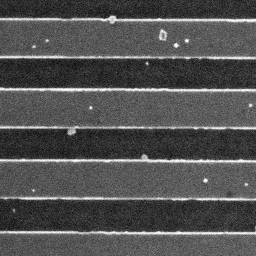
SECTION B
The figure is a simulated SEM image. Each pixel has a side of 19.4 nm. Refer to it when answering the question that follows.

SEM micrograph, lines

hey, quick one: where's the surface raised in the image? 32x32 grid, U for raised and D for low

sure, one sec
DDDDDDDDDDDDDDDDDDDDDDDDDDDDDDDD
DDDDDDDDDDDDDDDDDDDDDDDDDDDDDDDD
UUUUUUUUUUUUUUUUUUUUUUUUUUUUUDUU
UUUUUUUUUUUUUUUUUUUUUUUUUUUUUUUU
UUUUUUUUUUUUUUUUUUUUUUUUUUUUUUUU
UUUUUUUUUUUUUUUUUUUUUUUUUUUUUUUU
UUUUUUUUUUUUUUUUUUUUUUUUUUUUUUUU
DDDDDDDDDDDDDDDDDDDDDDDDDDDDDDDD
DDDDDDDDDDDDDDDDDDDDDDDDDDDDDDDD
DDDDDDDDDDDDDDDDDDDDDDDDDDDDDDDD
DDDDDDDDDDDDDDDDDDDDDDDDDDDDDDDD
UUUUUUUUUUUUUUUUUUUUUUUUUUUUUUUU
UUUUUUUUUUUUUUUUUUUUUUUUUUUUUUUU
UUUUUUUUUUUUUUUUUUUUUUUUUUUUUUUU
UUUUUUUUUUUUUUUUUUUUUUUUUUUUUUUU
UUUUUUUUUUUUUUUUUUUUUUUUUUUUUUUU
DDDDDDDDDDDDDDDDDDDDDDDDDDDDDDDD
DDDDDDDDDDDDDDDDDDDDDDDDDDDDDDDD
DDDDDDDDDDDDDDDDDDDDDDDDDDDDDDDD
DDDDDDDDDDDDDDDDDDDDDDDDDDDDDDDD
UUUUUUUUUUUUUUUUUUUUUUUUUUUUUUUU
UUUUUUUUUUUUUUUUUUUUUUUUUUUUUUUU
UUUUUUUUUUUUUUUUUUUUUUUUUUUUUUUU
UUUUUUUUUUUUUUUUUUUUUUUUUUUUUUUU
UUUUUUUUUUUUUUUUUUUUUUUUUUUUUUUU
DDDDDDDDDDDDDDDDDDDDDDDDDDDDDDDD
DDDDDDDDDDDDDDDDDDDDDDDDDDDDDDDD
DDDDDDDDDDDDDDDDDDDDDDDDDDDDDDDD
DDDDDDDDDDDDDDDDDDDDDDDDDDDDDDDD
UUUUUUUUUUUUUUUUUUUUUUUUUUUUUUUU
UUUUUUUUUUUUUUUUUUUUUUUUUUUUUUUU
UUUUUUUUUUUUUUUUUUUUUUUUUUUUUUUU